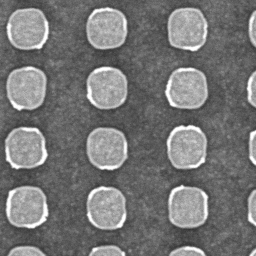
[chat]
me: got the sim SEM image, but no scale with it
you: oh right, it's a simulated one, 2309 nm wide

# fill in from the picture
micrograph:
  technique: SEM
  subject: a regular array of raised bodies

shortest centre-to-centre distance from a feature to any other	534	nanometers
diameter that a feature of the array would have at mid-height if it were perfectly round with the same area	378	nm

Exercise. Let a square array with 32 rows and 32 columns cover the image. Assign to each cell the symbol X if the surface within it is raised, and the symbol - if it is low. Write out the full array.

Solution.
--------------------------------
--XXX-------XXX-------XXX-------
-XXXXX-----XXXXX-----XXXXX-----X
-XXXXX-----XXXXX-----XXXXX-----X
-XXXXX-----XXXXX-----XXXXX-----X
--XXX------XXXX------XXXX-------
--------------------------------
--------------------------------
---X--------XX---------X--------
-XXXXX-----XXXX------XXXXX-----X
-XXXXX-----XXXXX-----XXXXX-----X
-XXXXX-----XXXXX-----XXXXX-----X
-XXXX------XXXXX-----XXXXX-----X
--XX---------X------------------
--------------------------------
--------------------------------
-XXXX-------XXX------XXXX-------
-XXXXX-----XXXXX-----XXXXX-----X
-XXXXX-----XXXXX-----XXXXX-----X
-XXXXX-----XXXXX-----XXXXX-----X
-XXXX-------XXX-------XXX-------
--------------------------------
--------------------------------
--XXX-------XX--------XX--------
-XXXXX-----XXXX------XXXXX-----X
-XXXXX-----XXXXX-----XXXXX-----X
-XXXXX-----XXXXX-----XXXXX-----X
-XXXXX-----XXXXX-----XXXXX-----X
------------XX------------------
--------------------------------
--------------------------------
-XXXX------XXXX-------XXX-------